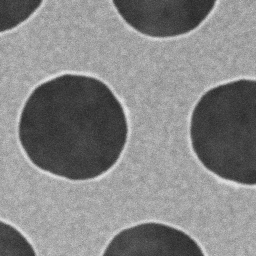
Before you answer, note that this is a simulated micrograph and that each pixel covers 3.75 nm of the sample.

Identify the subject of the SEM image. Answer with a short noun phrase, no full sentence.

holes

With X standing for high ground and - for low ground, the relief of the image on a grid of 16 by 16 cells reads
--XXXXX------XXX
-XXXXXXX-----XXX
XXXXXXXXXXXXXXXX
XXXXXXXXXXXXXXXX
XXXXXXXXXXXXXXXX
XX-----XXXXXX---
XX------XXXX----
X-------XXXX----
X-------XXXX----
XX------XXXX----
XX-----XXXXXX---
XXXXXXXXXXXXXXX-
XXXXXXXXXXXXXXXX
XXXXXXXXXXXXXXXX
-XXXXXXX---XXXXX
--XXXXX------XXX